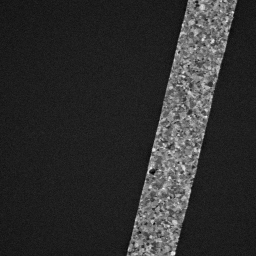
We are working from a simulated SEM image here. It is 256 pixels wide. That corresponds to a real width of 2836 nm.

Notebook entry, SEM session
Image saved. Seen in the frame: one or a few lines or trenches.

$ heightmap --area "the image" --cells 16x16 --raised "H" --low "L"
LLLLLLLLLLLLHHHL
LLLLLLLLLLLHHHLL
LLLLLLLLLLLHHHLL
LLLLLLLLLLLHHHLL
LLLLLLLLLLLHHHLL
LLLLLLLLLLHHHLLL
LLLLLLLLLLHHHLLL
LLLLLLLLLLHHHLLL
LLLLLLLLLLHHHLLL
LLLLLLLLLLHHLLLL
LLLLLLLLLLHHLLLL
LLLLLLLLLHHHLLLL
LLLLLLLLLHHHLLLL
LLLLLLLLLHHHLLLL
LLLLLLLLHHHLLLLL
LLLLLLLLHHHLLLLL